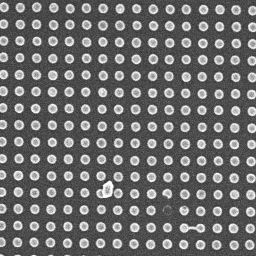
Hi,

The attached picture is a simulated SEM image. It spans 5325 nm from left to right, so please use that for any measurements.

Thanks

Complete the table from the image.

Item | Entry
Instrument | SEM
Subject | a regular array of raised bodies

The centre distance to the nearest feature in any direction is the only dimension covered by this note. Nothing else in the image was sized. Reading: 340 nm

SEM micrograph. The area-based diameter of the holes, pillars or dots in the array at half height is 179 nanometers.